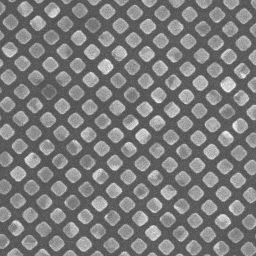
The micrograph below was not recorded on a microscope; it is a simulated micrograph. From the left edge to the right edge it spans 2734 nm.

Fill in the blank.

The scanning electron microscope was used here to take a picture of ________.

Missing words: a regular array of raised bodies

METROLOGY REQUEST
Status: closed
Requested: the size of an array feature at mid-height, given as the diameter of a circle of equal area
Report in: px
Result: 13.9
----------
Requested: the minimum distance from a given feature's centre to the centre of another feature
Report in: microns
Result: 0.205